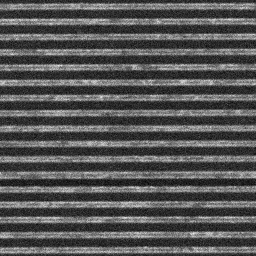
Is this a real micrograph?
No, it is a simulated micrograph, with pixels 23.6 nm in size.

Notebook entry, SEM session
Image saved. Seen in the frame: parallel lines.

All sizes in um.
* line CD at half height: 0.136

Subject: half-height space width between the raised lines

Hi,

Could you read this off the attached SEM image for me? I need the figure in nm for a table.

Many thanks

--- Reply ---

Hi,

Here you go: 224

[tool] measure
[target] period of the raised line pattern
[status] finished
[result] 358 nanometers